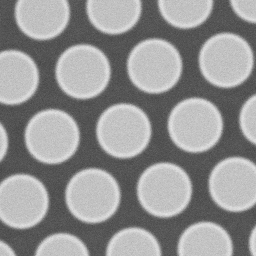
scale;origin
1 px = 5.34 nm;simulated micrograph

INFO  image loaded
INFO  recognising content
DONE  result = an array of small figures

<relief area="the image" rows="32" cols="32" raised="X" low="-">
--XXXXXX---XXXXXXX--XXXXXXX--XXX
--XXXXXXX--XXXXXXX--XXXXXX----XX
--XXXXXXX--XXXXXX----XXXXX-----X
---XXXXX----XXXX----------------
----XXX--------------------XXX--
-----------------XXXX-----XXXXX-
XX------XXXXX---XXXXXX---XXXXXX-
XXXX---XXXXXX---XXXXXXX--XXXXXXX
XXXXX--XXXXXXX--XXXXXXX--XXXXXX-
XXXXX--XXXXXXX--XXXXXX----XXXXX-
XXXXX--XXXXXX----XXXXX-----XXX--
XXXX----XXXXX------X------------
XXX--------------------XX------X
--------------XXX-----XXXXX---XX
----XXXXX----XXXXX---XXXXXXX--XX
----XXXXX---XXXXXXX--XXXXXXX--XX
X--XXXXXXX--XXXXXXX--XXXXXXX--XX
X--XXXXXXX--XXXXXXX---XXXXX----X
X--XXXXXXX---XXXXX-----XXX------
----XXXXX-----XXX---------------
--------------------X------XXXXX
----------XXX-----XXXXX---XXXXXX
-XXXX----XXXXX---XXXXXXX--XXXXXX
XXXXXX--XXXXXXX--XXXXXXX--XXXXXX
XXXXXX--XXXXXXX--XXXXXXX--XXXXXX
XXXXXX--XXXXXXX---XXXXX----XXXXX
XXXXXX---XXXXX-----XXX----------
XXXXX-----XXX-------------------
--X---------------------XXXX----
------XXX-----XXXXX----XXXXX---X
X----XXXXX----XXXXXX--XXXXXXX--X
XX---XXXXXX--XXXXXXX--XXXXXXX--X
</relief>